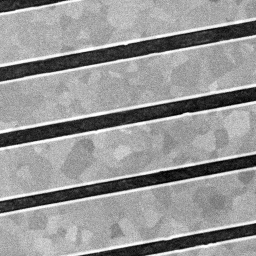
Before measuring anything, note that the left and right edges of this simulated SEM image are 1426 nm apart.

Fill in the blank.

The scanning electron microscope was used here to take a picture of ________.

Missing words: one or a few lines or trenches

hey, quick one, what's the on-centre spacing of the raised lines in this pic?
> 0.368 microns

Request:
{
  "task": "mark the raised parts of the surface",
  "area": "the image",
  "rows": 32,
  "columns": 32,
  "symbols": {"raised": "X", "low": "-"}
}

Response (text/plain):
-------XXXXXXXXXXXXXXXXXXXXXXXXX
--XXXXXXXXXXXXXXXXXXXXXXXXXXXXXX
XXXXXXXXXXXXXXXXXXXXXXXXXXXXXXX-
XXXXXXXXXXXXXXXXXXXXXXXXXX------
XXXXXXXXXXXXXXXXXXXX------------
XXXXXXXXXXXXXXX------------XXXXX
XXXXXXXXXX-----------XXXXXXXXXXX
XXXX------------XXXXXXXXXXXXXXXX
----------XXXXXXXXXXXXXXXXXXXXXX
-----XXXXXXXXXXXXXXXXXXXXXXXXXXX
XXXXXXXXXXXXXXXXXXXXXXXXXXXXXXXX
XXXXXXXXXXXXXXXXXXXXXXXXXXX-----
XXXXXXXXXXXXXXXXXXXXXX----------
XXXXXXXXXXXXXXXX------------XXXX
XXXXXXXXXXX-----------XXXXXXXXXX
XXXXX------------XXXXXXXXXXXXXXX
------------XXXXXXXXXXXXXXXXXXXX
-------XXXXXXXXXXXXXXXXXXXXXXXXX
XXXXXXXXXXXXXXXXXXXXXXXXXXXXXXXX
XXXXXXXXXXXXXXXXXXXXXXXXXXXXXX--
XXXXXXXXXXXXXXXXXXXXXXXX--------
XXXXXXXXXXXXXXXXXXX----------XXX
XXXXXXXXXXXXX-----------XXXXXXXX
XXXXXXXX-----------XXXXXXXXXXXXX
XX-----------XXXXXXXXXXXXXXXXXXX
--------XXXXXXXXXXXXXXXXXXXXXXXX
--XXXXXXXXXXXXXXXXXXXXXXXXXXXXXX
XXXXXXXXXXXXXXXXXXXXXXXXXXXXXXXX
XXXXXXXXXXXXXXXXXXXXXXXXXXXX----
XXXXXXXXXXXXXXXXXXXXXX----------
XXXXXXXXXXXXXXXXX----------XXXXX
XXXXXXXXXXXX----------XXXXXXXXXX